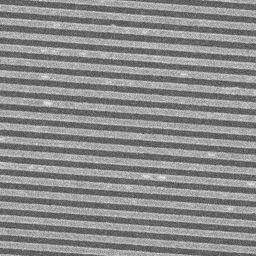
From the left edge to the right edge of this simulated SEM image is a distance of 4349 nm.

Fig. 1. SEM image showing parallel lines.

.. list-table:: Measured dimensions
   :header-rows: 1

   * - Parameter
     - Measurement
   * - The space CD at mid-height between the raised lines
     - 6.98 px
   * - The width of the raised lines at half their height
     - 6.11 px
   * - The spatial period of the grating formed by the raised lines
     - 222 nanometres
